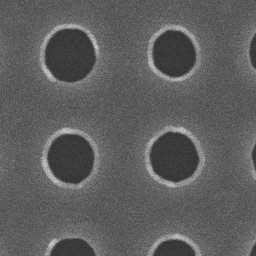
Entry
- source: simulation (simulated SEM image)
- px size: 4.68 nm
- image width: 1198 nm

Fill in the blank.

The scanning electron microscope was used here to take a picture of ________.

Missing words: holes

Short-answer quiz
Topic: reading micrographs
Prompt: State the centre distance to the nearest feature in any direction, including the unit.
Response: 0.484 microns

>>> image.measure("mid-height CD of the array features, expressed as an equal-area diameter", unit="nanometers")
232